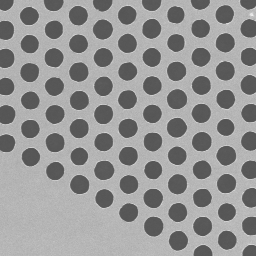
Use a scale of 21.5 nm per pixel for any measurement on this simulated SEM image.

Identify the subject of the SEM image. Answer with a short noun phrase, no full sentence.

a regular array of holes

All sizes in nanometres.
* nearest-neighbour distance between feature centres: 602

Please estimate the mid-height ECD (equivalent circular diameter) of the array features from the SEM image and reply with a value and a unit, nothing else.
405 nanometres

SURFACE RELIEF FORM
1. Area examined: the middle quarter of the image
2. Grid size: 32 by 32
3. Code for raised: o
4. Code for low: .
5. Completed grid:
oo....ooo..ooo....ooo..ooo....oo
o.....oooooooo....oooooooo.....o
o.....oooooooo....oooooooo.....o
oo....ooo..ooo....ooo..ooo....oo
oooooooo....oooooooo....oooooooo
oooooooo....oooooooo....oooooooo
oooooooo....oooooooo....oooo.ooo
oo....oo...ooo....ooo..ooo....oo
oo....oooooooo....oooooooo.....o
o.....oooooooo....oooooooo.....o
oo....ooo..ooo....ooo..ooo....oo
oooooooo....oooooooo....oooooooo
oooooooo....oooooooo....oooooooo
oooooooo....oooooooo....oooo.ooo
oo....oo...ooo....ooo..ooo....oo
oo....oooooooo....oooooooo.....o
o.....oooooooo....oooooooo.....o
oo....ooo..ooo....ooo...oo....oo
ooo.oooo....ooo.oooo....oooooooo
oooooooo....oooooooo.....ooooooo
oooooooo....oooooooo....oooooooo
oo...oooo..ooo....ooo..oooo...oo
oo....oooooooo....oooooooo.....o
oo....oooooooo....oooooooo.....o
oo....ooo..ooo....ooo..oooo...oo
oooooooo....oooooooo....oooooooo
oooooooo.....ooooooo.....ooooooo
oooooooo....oooooooo....oooooooo
oo....oo....oo....ooo..oooo...oo
oo....oooooooo....oooooooo.....o
oo....oooooooo.....ooooooo.....o
oo....ooo..ooo....ooo..ooo....oo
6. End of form